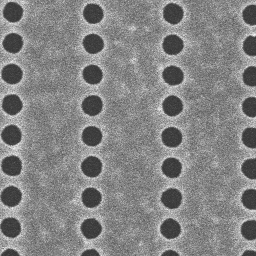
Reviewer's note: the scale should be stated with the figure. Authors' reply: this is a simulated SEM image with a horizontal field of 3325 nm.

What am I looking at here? a regular array of holes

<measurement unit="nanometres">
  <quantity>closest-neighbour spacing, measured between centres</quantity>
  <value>394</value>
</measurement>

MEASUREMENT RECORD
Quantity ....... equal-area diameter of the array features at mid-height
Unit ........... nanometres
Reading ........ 275